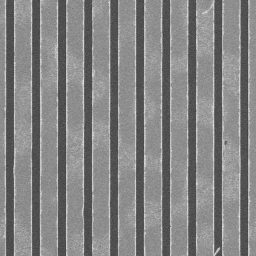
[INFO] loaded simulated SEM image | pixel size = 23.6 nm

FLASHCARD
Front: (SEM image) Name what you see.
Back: parallel lines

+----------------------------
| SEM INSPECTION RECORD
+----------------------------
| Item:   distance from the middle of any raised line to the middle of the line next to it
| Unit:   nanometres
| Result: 615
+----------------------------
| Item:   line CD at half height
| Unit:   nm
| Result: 411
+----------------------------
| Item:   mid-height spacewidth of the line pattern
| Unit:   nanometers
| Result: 201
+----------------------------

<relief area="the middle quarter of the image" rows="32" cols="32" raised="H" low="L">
LHHHHLLHHHHLLLHHHHLLHHHHLLLHHHHL
LHHHHLLHHHHLLLHHHHLLHHHHLLLHHHHL
LHHHHLLHHHHLLLHHHHLLHHHHLLLHHHHL
LHHHHLLHHHHLLLHHHHLLHHHHLLLHHHHL
LHHHHLLHHHHLLLHHHHLLHHHHLLLHHHHL
LHHHHLLHHHHLLLHHHHLLHHHHLLLHHHHL
LHHHHLLHHHHLLLHHHHLLHHHHLLLHHHHL
LHHHHLLHHHHLLLHHHHLLHHHHLLLHHHHL
LHHHHLLHHHHLLLHHHHLLHHHHLLLHHHHL
LHHHHLLHHHHLLLHHHHLLHHHHLLLHHHHL
LHHHHLLHHHHLLLHHHHLLHHHHLLLHHHHL
LHHHHLLHHHHLLLHHHHLLHHHHLLLHHHHL
LHHHHLLHHHHLLLHHHHLLHHHHLLLHHHHL
LHHHHLLHHHHLLLHHHHLLHHHHLLLHHHHL
LHHHHLLHHHHLLLHHHHLLHHHHLLLHHHHL
LHHHHLLHHHHLLLHHHHLLHHHHLLLHHHHL
LHHHHLLHHHHLLLHHHHLLHHHHLLLHHHHL
LHHHHLLHHHHLLLHHHHLLHHHHLLLHHHHL
LHHHHLLHHHHLLLHHHHLLHHHHLLLHHHHL
LHHHHLLHHHHLLLHHHHLLHHHHLLLHHHHL
LHHHHLLHHHHLLLHHHHLLHHHHLLLHHHHL
LHHHHLLHHHHLLLHHHHLLHHHHLLLHHHHL
LHLHHLLHHHHLLLHHHHLLHHHHLLLHHHHL
LHHHHLLHHHHLLLHHHHLLHHHHLLLHHHHL
LHHHHLLHHHHLLLHHHHLLHHHHLLLHHHHL
LHHLHLLHHHHLLLHHHHLLHHHHLLLHHHHL
LHHHHLLHHHHLLLHHHHLLHHHHLLLHHHHL
LHHHHLLHHHHLLLHHHHLLHHHHLLLHHHHL
LHHHHLLHHHHLLLHHHHLLHHHHLLLHHHHL
LHHHHLLHHHHLLLHHHHLLHHHHLLLHHHHL
LHHHHLLHHHHLLLHHHHLLHHHHLLLHHHHL
LHHHHLLHHHHLLLHHHHLLHHHHLLLHHHHL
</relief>